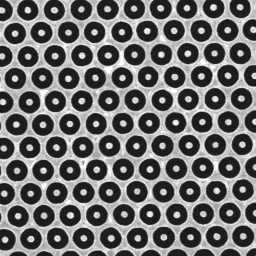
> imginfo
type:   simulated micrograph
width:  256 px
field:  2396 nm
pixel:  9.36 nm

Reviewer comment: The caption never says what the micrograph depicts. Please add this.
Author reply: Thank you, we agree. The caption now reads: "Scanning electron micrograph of a regular array of ring-shaped grooves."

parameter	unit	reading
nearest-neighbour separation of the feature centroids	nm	243